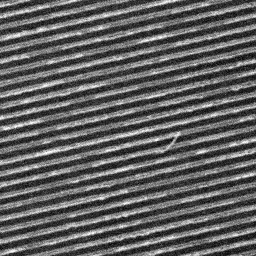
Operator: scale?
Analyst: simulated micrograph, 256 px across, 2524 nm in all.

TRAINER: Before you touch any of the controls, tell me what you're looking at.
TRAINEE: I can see parallel lines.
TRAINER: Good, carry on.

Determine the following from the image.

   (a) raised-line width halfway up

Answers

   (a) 37.2 nanometers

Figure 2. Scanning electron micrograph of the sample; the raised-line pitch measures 11 px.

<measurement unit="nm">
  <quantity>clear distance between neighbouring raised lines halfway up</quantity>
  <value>66.1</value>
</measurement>